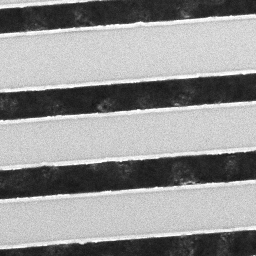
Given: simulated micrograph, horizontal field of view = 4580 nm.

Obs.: one or a few lines or trenches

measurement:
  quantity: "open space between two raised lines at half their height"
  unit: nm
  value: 821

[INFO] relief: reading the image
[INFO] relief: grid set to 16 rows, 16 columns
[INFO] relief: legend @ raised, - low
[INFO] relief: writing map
@@@@@@@@@@@@@@@@
@@@@@@@@@@------
----------------
----------------
---------------@
--@@@@@@@@@@@@@@
@@@@@@@@@@@@@@@-
@@--------------
----------------
--------------@@
@@@@@@@@@@@@@@@@
@@@@@@@@@@@@@@--
@---------------
----------------
-------------@@@
@@@@@@@@@@@@@@@@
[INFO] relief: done